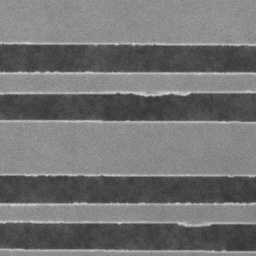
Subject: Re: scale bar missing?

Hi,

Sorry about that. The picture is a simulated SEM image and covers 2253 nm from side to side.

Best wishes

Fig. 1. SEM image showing lines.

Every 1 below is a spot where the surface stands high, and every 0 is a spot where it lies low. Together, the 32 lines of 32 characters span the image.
11111111111111111111111111111111
11111111111111111111111111111111
11111111111111111111111111111111
11111111111111111111111111111111
11111111111111111111111111111111
00000000000110101111111111111111
00000000000000000000000000000000
00000000000000000000000000000000
00000000000000000000000000000000
11111111111111111111111111111111
11111111111111111111111111111111
11111111111111111111111111111111
00000000000000000000000000000000
00000000000000000000000000000000
00000000000000000000000000000000
11111111111111111111111111111111
11111111111111111111111111111111
11111111111111111111111111111111
11111111111111111111111111111111
11111111111111111111111111111111
11111111111111111111111111111111
11111111111111111111111111111111
00000000000000000000000000000000
00000000000000000000000000000000
00000000000000000000000000000000
00000000011000000100000000101001
11111111111111111111111111111111
11111111111111111111111111111111
00000000000000000000000000000000
00000000000000000000000000000000
00000000000000000000000000000000
11111111111111111111111111111111